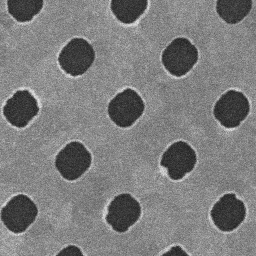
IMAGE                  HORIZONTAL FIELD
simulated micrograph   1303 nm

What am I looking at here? a regular array of holes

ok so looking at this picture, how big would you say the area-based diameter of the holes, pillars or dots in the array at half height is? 184 nanometers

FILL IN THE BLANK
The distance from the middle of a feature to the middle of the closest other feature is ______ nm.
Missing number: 368